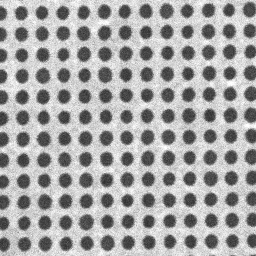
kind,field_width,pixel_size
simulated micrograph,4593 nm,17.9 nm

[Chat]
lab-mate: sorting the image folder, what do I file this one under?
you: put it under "a regular array of holes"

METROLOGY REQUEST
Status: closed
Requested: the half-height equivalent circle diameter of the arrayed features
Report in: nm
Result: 268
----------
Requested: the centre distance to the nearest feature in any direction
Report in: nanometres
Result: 371